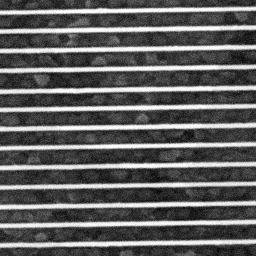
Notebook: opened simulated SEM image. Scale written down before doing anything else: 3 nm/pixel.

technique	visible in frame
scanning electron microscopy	parallel lines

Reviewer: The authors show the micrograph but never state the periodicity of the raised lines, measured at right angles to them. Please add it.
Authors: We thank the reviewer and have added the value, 58.2 nanometers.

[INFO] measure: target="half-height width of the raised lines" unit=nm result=11.2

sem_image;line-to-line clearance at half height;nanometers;47.6